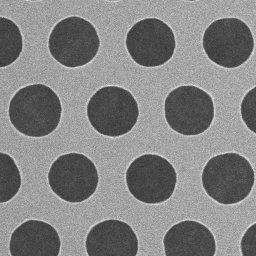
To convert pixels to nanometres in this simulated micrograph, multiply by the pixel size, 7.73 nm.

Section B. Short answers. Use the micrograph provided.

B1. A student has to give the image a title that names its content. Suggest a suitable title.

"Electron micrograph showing a regular array of holes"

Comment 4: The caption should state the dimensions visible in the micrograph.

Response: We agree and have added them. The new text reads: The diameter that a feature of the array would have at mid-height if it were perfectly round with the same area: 390 nanometres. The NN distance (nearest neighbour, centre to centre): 596 nm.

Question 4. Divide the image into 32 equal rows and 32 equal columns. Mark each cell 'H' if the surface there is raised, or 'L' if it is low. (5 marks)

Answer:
HHHHHHHHHHHHHHHHHHHHHHHHHHHHHHHH
HHHHHHHHHHHHHHHHHHHHHHHHHHHHHHHH
LHHHHHHHLLLHHHHHHHLLHHHHHHHLLLHH
LLHHHHHLLLLLHHHHLLLLLHHHHHLLLLLH
LLLHHHLLLLLLHHHHLLLLLLHHHLLLLLLL
LLLHHHLLLLLLHHHHLLLLLLHHHLLLLLLL
LLLHHHLLLLLLHHHHLLLLLLHHHHLLLLLL
LLHHHHHLLLLHHHHHHLLLLHHHHHLLLLLH
HHHHHHHHHHHHHHHHHHHHHHHHHHHHHHHH
HHHHHHHHHHHHHHHHHHHHHHHHHHHHHHHH
HHHHHHHHHHHHHHHHHHHHHHHHHHHHHHHH
HHLLLLLHHHHHLLLLHHHHHLLLLLHHHHHL
HLLLLLLHHHHLLLLLLHHHHLLLLLHHHHLL
HLLLLLLLHHHLLLLLLHHHHLLLLLLHHHLL
HLLLLLLLHHHLLLLLLHHHHLLLLLLHHHLL
HHLLLLLHHHHLLLLLLHHHHLLLLLHHHHHL
HHLLLLHHHHHHLLLLHHHHHHLLLHHHHHHH
HHHHHHHHHHHHHHHHHHHHHHHHHHHHHHHH
HHHHHHHHHHHHHHHHHHHHHHHHHHHHHHHH
LHHHHHHHLLLHHHHHHHLLHHHHHHHLLLHH
LLHHHHHLLLLLHHHHLLLLLHHHHHLLLLLH
LLHHHHLLLLLLHHHHLLLLLLHHHLLLLLLL
LLLHHHLLLLLLHHHHLLLLLLHHHLLLLLLL
LLHHHHLLLLLLHHHHLLLLLLHHHLLLLLLH
LLHHHHHLLLLHHHHHHLLLLHHHHHLLLLLH
HHHHHHHHHHHHHHHHHHHHHHHHHHHHLHHH
HHHHHHHHHHHHHHHHHHHHHHHHHHHHHHHH
HHHHLHHHHHHHHHHHHHHHHHHHHHHHHHHH
HHLLLLLHHHHHLLLLHHHHHLLLLLHHHHHL
HLLLLLLHHHHLLLLLLHHHHLLLLLLHHHLL
HLLLLLLLHHHLLLLLLHHHHLLLLLLHHHLL
HLLLLLLHHHHLLLLLLHHHHLLLLLLHHHLL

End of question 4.